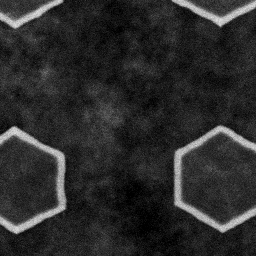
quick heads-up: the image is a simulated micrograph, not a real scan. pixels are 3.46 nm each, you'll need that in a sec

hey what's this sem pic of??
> raised bodies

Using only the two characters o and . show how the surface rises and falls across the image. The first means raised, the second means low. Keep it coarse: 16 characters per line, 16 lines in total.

ooo.........oooo
................
................
................
................
................
................
................
oo...........oo.
ooo........ooooo
oooo.......ooooo
oooo.......ooooo
oooo.......ooooo
ooo.........ooo.
................
................